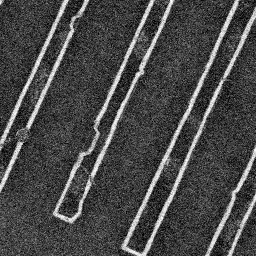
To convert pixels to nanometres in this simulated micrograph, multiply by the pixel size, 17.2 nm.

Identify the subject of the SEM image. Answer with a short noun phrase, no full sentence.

one or a few lines or trenches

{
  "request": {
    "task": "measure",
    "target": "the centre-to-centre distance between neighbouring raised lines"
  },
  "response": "1340 nanometres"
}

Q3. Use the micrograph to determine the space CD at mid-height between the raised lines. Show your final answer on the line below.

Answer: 1020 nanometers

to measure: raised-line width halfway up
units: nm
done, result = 334